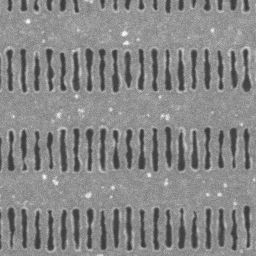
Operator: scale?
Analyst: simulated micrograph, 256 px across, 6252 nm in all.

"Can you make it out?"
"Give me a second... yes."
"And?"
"a regular array of holes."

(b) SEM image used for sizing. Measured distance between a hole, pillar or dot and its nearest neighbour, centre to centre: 325 nanometers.